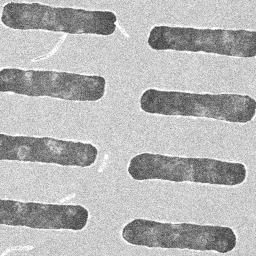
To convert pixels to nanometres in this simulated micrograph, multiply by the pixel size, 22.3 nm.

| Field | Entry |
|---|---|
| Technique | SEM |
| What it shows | holes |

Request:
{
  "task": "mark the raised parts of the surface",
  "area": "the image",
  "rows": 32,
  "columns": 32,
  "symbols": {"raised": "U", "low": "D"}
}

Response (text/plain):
UDDDDUUUUUUUUUUUUUUUUUUUUUUUUUUU
DDDDDDDDDDDDDDUUUUUUUUUUUUUUUUUU
DDDDDDDDDDDDDDDUUUUUUUUUUUUUUUUU
UDDDDDDDDDDDDDUUUUUDDDDDUUUUUUUU
UUUUUUUUUUUUUUUUUUUDDDDDDDDDDDDD
UUUUUUUUUUUUUUUUUUUDDDDDDDDDDDDD
UUUUUUUUUUUUUUUUUUUUUUUUDDDDDDDD
UUUUUUUUUUUUUUUUUUUUUUUUUUUUUUUU
UDUUUUUUUUUUUUUUUUUUUUUUUUUUUUUU
DDDDDDDDDDDDUUUUUUUUUUUUUUUUUUUU
DDDDDDDDDDDDDUUUUUUUUUUUUUUUUUUU
DDDDDDDDDDDDDUUUUUDDDDDUUUUUUUUU
UUUUUUUUDDDDUUUUUUDDDDDDDDDDDDDD
UUUUUUUUUUUUUUUUUUDDDDDDDDDDDDDD
UUUUUUUUUUUUUUUUUUUUUDUDDDDDDDDD
UUUUUUUUUUUUUUUUUUUUUUUUUUUUUUUU
UUUUUUUUUUUUUUUUUUUUUUUUUUUUUUUU
DDDDDDDDUUUUUUUUUUUUUUUUUUUUUUUU
DDDDDDDDDDDDUUUUUUUUUUUUUUUUUUUU
DDDDDDDDDDDDUUUUUDDDDDUUUUUUUUUU
UUUUUUDDDDDDUUUUDDDDDDDDDDDDDDUU
UUUUUUUUUUUUUUUUDDDDDDDDDDDDDDDU
UUUUUUUUUUUUUUUUUDUUDDDDDDDDDDDU
UUUUUUUUUUUUUUUUUUUUUUUUUUUUUUUU
UUUUUUUUUUUUUUUUUUUUUUUUUUUUUUUU
DDDDDDUUUUUUUUUUUUUUUUUUUUUUUUUU
DDDDDDDDDDDUUUUUUUUUUUUUUUUUUUUU
DDDDDDDDDDDUUUUUUDDUUUUUUUUUUUUU
UUUUDDDDDDUUUUUUDDDDDDDDDDDDDUUU
UUUUUUUUUUUUUUUDDDDDDDDDDDDDDUUU
UUUUUUUUUUUUUUUUUDDDDDDDDDDDDDUU
UUUUUUUUUUUUUUUUUUUUUUUUUUUDUUUU